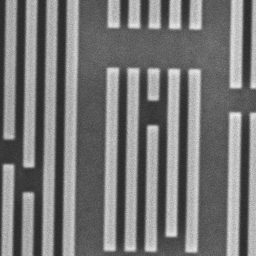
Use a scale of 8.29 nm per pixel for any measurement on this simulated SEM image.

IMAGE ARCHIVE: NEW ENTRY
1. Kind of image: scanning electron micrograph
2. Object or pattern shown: groups of lines, slits or small figures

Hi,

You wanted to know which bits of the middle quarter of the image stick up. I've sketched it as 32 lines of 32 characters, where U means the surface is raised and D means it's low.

DUUDDDDDDDDDDDDDDDDDDDDDDDDDDDDD
DUUDDDDDDDDUUDDDUUUDDUUUDDUUUDDU
DUUDDDDDDDDUUDDDUUUDDUUUDDUUUDDU
UUUDDDDDDDDUUDDDUUUDDUUUDDUUUDDU
UUUDDDDDDDDUUDDDUUUDDUUUDDUUUDDU
UUUDDDDDDDDUUDDDUUUDDUUUDDUUUDDU
UUUDDDDDDDDUUDDDUUUDDUUUDDUUUDDU
UUUDDDDDDDDUUDDDUUDDDUUUDDUUUDDU
UUUDDDDDDDDUUDDDUUDDDUUUDDUUUDDU
UUUDDDDDDDDUUDDDUUDDDDDDDDUUUDDU
UUUDDDDDDDDUUDDDUUDDDDDDDDUUUDDU
UUUDDDDDDDDUUDDDUUDDDDDDDDUUUDDU
UUUDDDDDDDDUUDDDUUDDDDDDDDUUUDDU
UUUDDDDDDDDUUDDDUUDDDDDDDDUUUDDU
UUUDDDDDDDDUUDDDUUDDDDDDDDUUUDDU
UUUDDDDDDDDUUDDDUUDDDUUDDDUUUDDU
UUUDDDDDDDDUUDDDUUDDDUUDDDUUUDDU
UUUDDDDDDDDUUDDDUUDDDUUDDDUUUDDU
UUUDDDDDDDDUUDDDUUDDDUUDDDUUUDDU
UUUDDDDDDDDUUDDDUUDDDUUDDDUUUDDU
UUUDDDDDDDDUUDDDUUDDDUUDDDUUUDDU
UUUDDDDDDDDUUDDDUUDDDUUDDDUUUDDU
UUUDDDDDDDDUUDDDUUDDDUUDDDUUDDDU
UUUDDDDDDDDUUDDDUUDDDUUDDDUUDDDU
UUUDDDDDDDDUUDDDUUDDDUUDDDUUDDDU
UUUDDDDDDDDUUDDDUUDDDUUDDDUUDDDU
UUUDDDDDDDDUUDDUUUDDDUUDDDUUDDDU
UUUDDDDDDDDUUDDUUUDDDUUDDDUUDDDU
UUUDDDDDDDDUUDDUUUDDDUUDDDUUDDDU
UUUDDDDDDDDUUDDUUUDDDUUDDDUUDDDU
UUUDDDDDDDDUUDDUUUDDDUUDDDUUDDDU
UUUDDDDDDDDUUDDUUUDDDUUDDDUUDDDU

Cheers